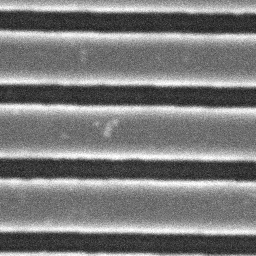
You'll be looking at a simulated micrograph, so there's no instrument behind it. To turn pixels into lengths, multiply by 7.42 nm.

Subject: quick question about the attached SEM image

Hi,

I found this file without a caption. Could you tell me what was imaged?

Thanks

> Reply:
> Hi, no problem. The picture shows lines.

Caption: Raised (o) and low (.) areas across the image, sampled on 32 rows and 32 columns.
oooooooooooooooooooooooooooooooo
.............................oo.
................................
................................
oooooooooooooooooooooooooooooooo
oooooooooooooooooooooooooooooooo
oooooooooooooooooooooooooooooooo
oooooooooooooooooooooooooooooooo
oooooooooooooooooooooooooooooooo
oooooooooooooooooooooooooooooooo
...................ooooooooooooo
................................
................................
oooooooooooooooooooooo..........
oooooooooooooooooooooooooooooooo
oooooooooooooooooooooooooooooooo
oooooooooooooooooooooooooooooooo
oooooooooooooooooooooooooooooooo
oooooooooooooooooooooooooooooooo
oooooooooooooooooooooooooooooooo
................................
................................
................................
oooooooooooooooooooooooooooooooo
oooooooooooooooooooooooooooooooo
oooooooooooooooooooooooooooooooo
oooooooooooooooooooooooooooooooo
oooooooooooooooooooooooooooooooo
oooooooooooooooooooooooooooooooo
................................
................................
................................